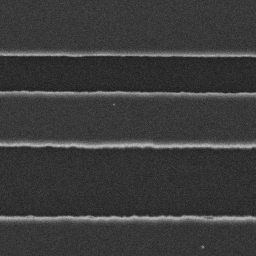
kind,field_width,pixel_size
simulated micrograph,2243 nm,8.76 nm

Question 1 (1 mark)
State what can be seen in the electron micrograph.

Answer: lines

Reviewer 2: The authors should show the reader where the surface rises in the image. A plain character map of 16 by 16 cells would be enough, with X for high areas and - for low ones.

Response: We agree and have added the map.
XXXXXXXXXXXXXXXX
XXXXXXXXXXXXXXXX
XXXXXXXXXXXXXXXX
-----------XXXXX
----------------
----------------
XXXXXXXXXXXXXXXX
XXXXXXXXXXXXXXXX
XXXXXXXXXXXXXXXX
----------------
----------------
----------------
----------------
----------------
XXXXXXXXXXXXXXXX
XXXXXXXXXXXXXXXX